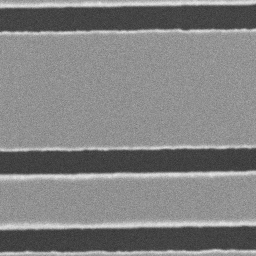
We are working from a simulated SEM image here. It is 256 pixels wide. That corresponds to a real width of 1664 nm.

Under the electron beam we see lines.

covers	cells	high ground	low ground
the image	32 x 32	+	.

++++++++++++++++++++++++++++++++
................................
................................
................................
++++++++++++++++++++++++++++++++
++++++++++++++++++++++++++++++++
++++++++++++++++++++++++++++++++
++++++++++++++++++++++++++++++++
++++++++++++++++++++++++++++++++
++++++++++++++++++++++++++++++++
++++++++++++++++++++++++++++++++
++++++++++++++++++++++++++++++++
++++++++++++++++++++++++++++++++
++++++++++++++++++++++++++++++++
++++++++++++++++++++++++++++++++
++++++++++++++++++++++++++++++++
++++++++++++++++++++++++++++++++
++++++++++++++++++++++++++++++++
++++++++++++++++++++++++++++++.+
................................
................................
...............................+
++++++++++++++++++++++++++++++++
++++++++++++++++++++++++++++++++
++++++++++++++++++++++++++++++++
++++++++++++++++++++++++++++++++
++++++++++++++++++++++++++++++++
++++++++++++++++++++++++++++++++
+++++++++.......................
................................
................................
...+..+...+++++.++++++++++++++++